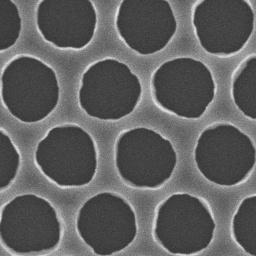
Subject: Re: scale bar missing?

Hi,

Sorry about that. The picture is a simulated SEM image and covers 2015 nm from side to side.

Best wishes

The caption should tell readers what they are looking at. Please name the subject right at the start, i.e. holes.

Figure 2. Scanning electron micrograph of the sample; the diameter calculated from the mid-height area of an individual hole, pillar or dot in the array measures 0.481 microns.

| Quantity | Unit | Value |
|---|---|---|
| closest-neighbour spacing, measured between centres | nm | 601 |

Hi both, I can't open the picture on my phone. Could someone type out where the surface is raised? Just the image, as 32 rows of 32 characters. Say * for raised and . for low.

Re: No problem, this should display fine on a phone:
..***......****......****......*
..***.......***.......**........
...**.......***.......**........
...**.......***.......**........
..***.......***.......***......*
..*****....*****.....****......*
*****************..*******...***
**...********.*******...*******.
*.....*****.....****......****..
.......***.......**.......***...
.......***........*........**...
.......***........*........**...
.......***.......***.......**...
*......***.......****.....****..
**....*****.....*******..******.
***************************..***
******.....*****...******.....**
.****.......***......****......*
..***.......**........**........
..**........**........**........
..***.......**........***.......
..***.......***.......***......*
..*****....****......*****....**
.****************.**************
**...*******...******...********
*.....****......****.....*****..
.......***.......***......****..
.......***.......***.......**...
........**.......**........**...
.......***.......**........**...
.......****.....****......****..
**....******..*******....******.